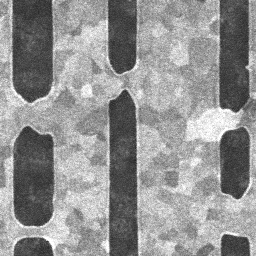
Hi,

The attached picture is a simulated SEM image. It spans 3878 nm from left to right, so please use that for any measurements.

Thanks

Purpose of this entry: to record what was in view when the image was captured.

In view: one or a few lines or trenches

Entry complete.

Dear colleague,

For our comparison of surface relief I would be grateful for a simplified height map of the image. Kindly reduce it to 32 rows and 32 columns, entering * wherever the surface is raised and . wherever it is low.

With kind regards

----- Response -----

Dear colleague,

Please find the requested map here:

*......******....**********....*
*......******....**********....*
*......******....**********....*
*......******....**********....*
*......******....**********....*
*......******....**********....*
*......******....**********....*
*......*******...**********....*
*......*******...**********....*
*......********************....*
*......********************....*
**....*********.***********....*
***..*********...**********....*
*************....***********..**
**************...***************
**************...***************
***..*********...***********...*
**.....*******...**********....*
**.....*******...**********....*
**.....*******...**********....*
**.....*******...**********....*
**.....*******...**********....*
**.....*******...**********....*
**.....*******...***********...*
**.....*******...************.**
**.....*******...***************
**.....*******...***************
**....*******....***************
*************....***************
*************....***********..**
**....*******....***********...*
**.....******....**********....*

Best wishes